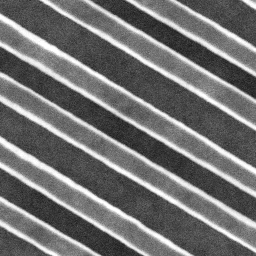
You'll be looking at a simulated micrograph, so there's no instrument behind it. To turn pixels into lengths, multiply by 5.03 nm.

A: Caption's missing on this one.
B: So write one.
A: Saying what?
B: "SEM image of lines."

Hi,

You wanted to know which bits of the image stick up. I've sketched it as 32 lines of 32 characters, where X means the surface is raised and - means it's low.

------XXXXXX-----XXXXXX--------X
-------XXXXXX-----XXXXXX--------
X--------XXXXXX-----XXXXXX------
XXX--------XXXXXX-----XXXXXX----
XXXX---------XXXXX-----XXXXXX---
XXXXXX--------XXXXXX-----XXXXXX-
-XXXXXXX--------XXXXXX-----XXXXX
---XXXXXX--------XXXXXXX-----XXX
-----XXXXXX--------XXXXXX-----XX
X-----XXXXXXX--------XXXXXX-----
XX------XXXXXX---------XXXXXX---
XXXX------XXXXXX--------XXXXXX--
XXXXXX------XXXXXX--------XXXXXX
--XXXXXX-----XXXXXX---------XXXX
---XXXXXX------XXXXXX--------XXX
-----XXXXXX------XXXXXX--------X
-------XXXXXX-----XXXXXX--------
--------XXXXXX------XXXXXX------
XX--------XXXXXX------XXXXX-----
XXXX--------XXXXXX-----XXXXXX---
XXXXX--------XXXXXX------XXXXXX-
-XXXXXX--------XXXXXX------XXXXX
---XXXXXX--------XXXXXX-----XXXX
----XXXXXX---------XXXXX------XX
------XXXXXX--------XXXXXX------
X------XXXXXX---------XXXXXX----
XXX------XXXXXX--------XXXXXX---
XXXXX------XXXXXX--------XXXXXX-
-XXXXXX-----XXXXXX---------XXXXX
--XXXXXX------XXXXXX---------XXX
----XXXXXX------XXXXXX--------XX
------XXXXXX-----XXXXXX---------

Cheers